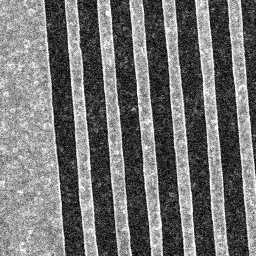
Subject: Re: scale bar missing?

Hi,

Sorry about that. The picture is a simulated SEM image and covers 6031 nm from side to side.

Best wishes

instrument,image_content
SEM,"parallel lines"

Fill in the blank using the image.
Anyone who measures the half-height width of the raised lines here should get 279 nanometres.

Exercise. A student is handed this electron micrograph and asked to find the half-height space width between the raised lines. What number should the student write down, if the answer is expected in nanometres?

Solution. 484